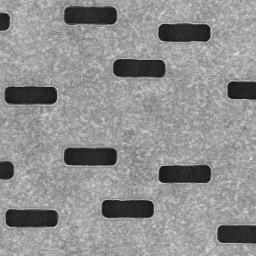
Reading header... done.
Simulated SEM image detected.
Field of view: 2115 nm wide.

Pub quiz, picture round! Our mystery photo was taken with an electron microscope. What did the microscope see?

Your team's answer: a regular array of holes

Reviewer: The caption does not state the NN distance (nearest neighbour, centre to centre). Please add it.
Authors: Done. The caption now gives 542 nm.